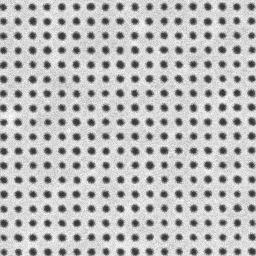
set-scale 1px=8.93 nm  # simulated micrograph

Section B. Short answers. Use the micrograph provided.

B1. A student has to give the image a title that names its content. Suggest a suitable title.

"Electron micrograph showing a regular array of holes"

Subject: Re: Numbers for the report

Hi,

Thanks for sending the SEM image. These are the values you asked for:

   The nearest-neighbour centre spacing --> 126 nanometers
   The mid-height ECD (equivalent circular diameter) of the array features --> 72.7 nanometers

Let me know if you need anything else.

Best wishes